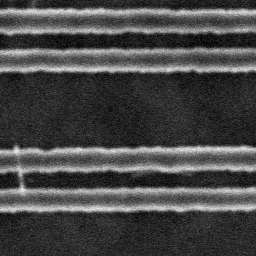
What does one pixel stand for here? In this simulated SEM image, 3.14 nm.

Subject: lines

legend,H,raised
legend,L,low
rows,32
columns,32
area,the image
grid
LLLLLLLLLLLLLLLLLLLLLLLLLLLLLLLL
HHHHHHHHHHHHHHHHHHHHHHHHHHHHHHHH
HHHHHHHHHHHHHHHHHHHHHHHHHHHHHHHH
HHHHHHHHHHHHHHHHHHHHHHHHHHHHHHHH
LLLLLLLLLLLLLLLLLLLLLLLLLLLLLLLL
LLLLLLLLLLLLLLLLLLLLLLLLLLLLLLLL
HHHHHHHHHHHHHHHHHHHHHHHHHHHHHHHH
HHHHHHHHHHHHHHHHHHHHHHHHHHHHHHHH
HHHHHHHHHHHHHHHHHHHHHHHHHHHHHHHH
LLLLLLLLLLLLLLLLLLLLLLLLLLLLLLLL
LLLLLLLLLLLLLLLLLLLLLLLLLLLLLLLL
LLLLLLLLLLLLLLLLLLLLLLLLLLLLLLLL
LLLLLLLLLLLLLLLLLLLLLLLLLLLLLLLL
LLLLLLLLLLLLLLLLLLLLLLLLLLLLLLLL
LLLLLLLLLLLLLLLLLLLLLLLLLLLLLLLL
LLLLLLLLLLLLLLLLLLLLLLLLLLLLLLLL
LLLLLLLLLLLLLLLLLLLLLLLLLLLLLLLL
LLLLLLLLLLLLLLLLLLLLLLLLLLLLLLLL
LLLLLLLLLLLLLLLLLHLHLLHHHHHHHHHH
HHHHHHHHHHHHHHHHHHHHHHHHHHHHHHHH
HHHHHHHHHHHHHHHHHHHHHHHHHHHHHHHH
HLHHLLLLLLLLLLLLLLLLLLLLLLLLLLLL
LLLLLLLLLLLLLLLLLLLLLLLLLLLLLLLL
LLLLLLLLLLLLLLLLLLLLLLLLLLLLLLLH
HHHHHHHHHHHHHHHHHHHHHHHHHHHHHHHH
HHHHHHHHHHHHHHHHHHHHHHHHHHHHHHHH
LLLLLLLLLLLLLLLLLLLLLLLLLLLLLLLL
LLLLLLLLLLLLLLLLLLLLLLLLLLLLLLLL
LLLLLLLLLLLLLLLLLLLLLLLLLLLLLLLL
LLLLLLLLLLLLLLLLLLLLLLLLLLLLLLLL
LLLLLLLLLLLLLLLLLLLLLLLLLLLLLLLL
LLLLLLLLLLLLLLLLLLLLLLLLLLLLLLLL